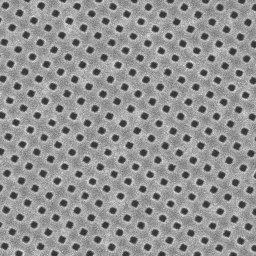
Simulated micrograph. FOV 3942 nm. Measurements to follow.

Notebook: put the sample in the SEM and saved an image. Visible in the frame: a regular array of holes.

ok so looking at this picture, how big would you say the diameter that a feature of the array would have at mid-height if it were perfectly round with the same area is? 123 nanometers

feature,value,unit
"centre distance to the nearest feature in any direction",241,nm